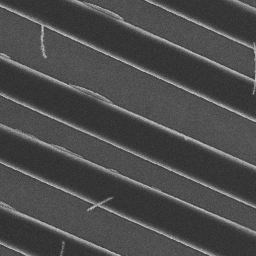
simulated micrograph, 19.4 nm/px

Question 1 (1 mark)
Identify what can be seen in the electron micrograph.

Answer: lines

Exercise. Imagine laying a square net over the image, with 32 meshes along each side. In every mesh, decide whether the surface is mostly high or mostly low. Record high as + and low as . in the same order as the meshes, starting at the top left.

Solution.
++++++++++.........+++++++++++..
..++++++++++++.......+++++++++++
....+++++++++++.........++++++++
......+++++++++++.........++++++
........+++++++++++.........++++
...........+++++++++++........++
.............+++++++++++........
+..............+++++++++++......
+++..............+++++++++++....
++++++.............++++++++++++.
++++++++..............++++++++++
+++++++++++.............++++++++
.++++++++++++.............++++++
....+++++++++++.............++++
......+++++++++++.............++
........++++++++++++............
++.........+++++++++++..........
+++++........+++++++++++........
+++++++........++++++++++++.....
+++++++++........++++++++++++...
++++++++++++........+++++++++++.
...+++++++++++........++++++++++
.....+++++++++++........++++++++
.......++++++++++++.......++++++
.........++++++++++++.......++++
...........+++++++++++++.......+
++............++++++++++++......
+++++...........++++++++++++....
+++++++............++++++++++++.
+++++++++............+++++++++++
+++++++++++............+++++++++
..++++++++++++...........+++++++